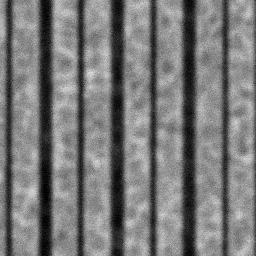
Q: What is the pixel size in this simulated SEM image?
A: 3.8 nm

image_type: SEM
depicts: parallel lines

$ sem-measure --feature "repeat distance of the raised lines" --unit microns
0.137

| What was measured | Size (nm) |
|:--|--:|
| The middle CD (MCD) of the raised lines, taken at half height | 95.1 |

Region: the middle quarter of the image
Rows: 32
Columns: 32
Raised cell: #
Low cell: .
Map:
###..######....######..######...
###..######....######..######...
###..######....######..######...
###..######....######..######...
###..######....######..######...
###..######....######..######...
###..######....######..######...
###..######....######..######...
###..######....######..######...
###..######....######..######...
###..######....######..######...
###..######....######..######...
###..######....######..######...
###..######....######..######...
###..######....######..######...
###..######....######..######...
###..######....######..######...
###..######....######..######...
###..######....######..######...
###..######....######..######...
###..######....######..######...
###..######....######..######...
###..######....######..######...
###..######....######..######...
###..######....######..######...
###..######....######..######...
###..######....######..######...
###..######....######..######...
###..######....######..######...
###..######....######..######...
###..######....######..######...
###..######....######..######...